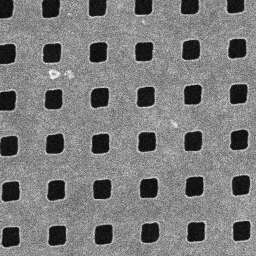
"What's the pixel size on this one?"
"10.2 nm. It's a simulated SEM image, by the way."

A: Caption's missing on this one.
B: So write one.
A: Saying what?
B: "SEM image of a regular array of holes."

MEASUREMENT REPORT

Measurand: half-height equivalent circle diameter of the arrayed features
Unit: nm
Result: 212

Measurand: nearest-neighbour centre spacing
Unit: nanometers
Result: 461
